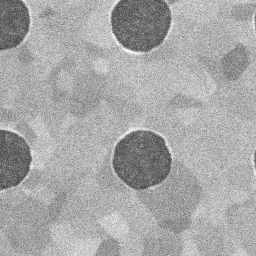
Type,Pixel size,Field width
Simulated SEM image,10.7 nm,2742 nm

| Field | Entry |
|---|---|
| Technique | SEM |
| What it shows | holes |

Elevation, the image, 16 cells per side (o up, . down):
..ooooo....ooooo
..ooooo....ooooo
.oooooo...oooooo
oooooooooooooooo
oooooooooooooooo
oooooooooooooooo
oooooooooooooooo
oooooooooooooooo
.ooooooo..oooooo
..ooooo....ooooo
..ooooo....ooooo
.ooooooo..oooooo
oooooooooooooooo
oooooooooooooooo
oooooooooooooooo
oooooooooooooooo